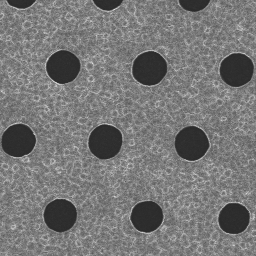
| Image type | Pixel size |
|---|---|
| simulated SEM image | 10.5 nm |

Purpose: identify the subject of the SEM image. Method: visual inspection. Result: a regular array of holes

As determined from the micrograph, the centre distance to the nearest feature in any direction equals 0.901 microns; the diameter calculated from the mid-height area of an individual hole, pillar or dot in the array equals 352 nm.